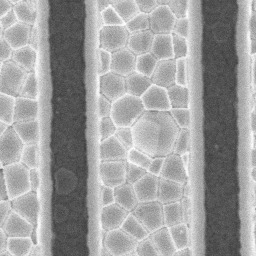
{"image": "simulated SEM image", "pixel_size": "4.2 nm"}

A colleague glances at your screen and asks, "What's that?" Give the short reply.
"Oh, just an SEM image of one or a few lines or trenches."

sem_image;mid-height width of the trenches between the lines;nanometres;207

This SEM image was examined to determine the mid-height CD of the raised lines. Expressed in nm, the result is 430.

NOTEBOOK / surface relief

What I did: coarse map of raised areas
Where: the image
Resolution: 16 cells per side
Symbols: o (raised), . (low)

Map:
ooo...oooooo...o
ooo...oooooo...o
ooo...oooooo...o
ooo...oooooo...o
ooo...oooooo...o
ooo...oooooo...o
ooo...oooooo...o
ooo...oooooo...o
ooo...oooooo...o
ooo...oooooo...o
ooo...oooooo...o
ooo...oooooo...o
ooo...oooooo...o
ooo...oooooo...o
ooo...oooooo...o
ooo...oooooo...o